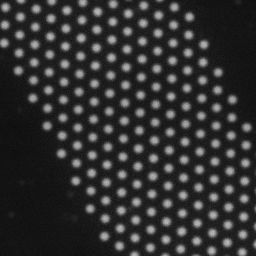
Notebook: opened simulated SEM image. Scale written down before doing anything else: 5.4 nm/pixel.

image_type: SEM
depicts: a regular array of raised bodies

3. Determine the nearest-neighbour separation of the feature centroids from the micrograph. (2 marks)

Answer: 94.5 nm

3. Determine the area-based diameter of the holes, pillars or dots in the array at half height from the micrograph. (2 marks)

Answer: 41.3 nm